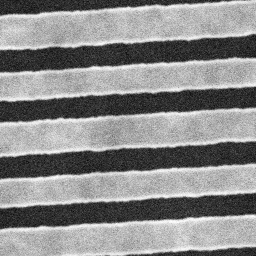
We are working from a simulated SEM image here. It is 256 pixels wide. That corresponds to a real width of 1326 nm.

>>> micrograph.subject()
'lines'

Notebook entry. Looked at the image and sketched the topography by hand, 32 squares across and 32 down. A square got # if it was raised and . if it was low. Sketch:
.........................#######
.........#######################
################################
################################
###############################.
##############..................
................................
............................####
..........######################
################################
################################
##################.#............
##..............................
................................
..............##################
################################
################################
################################
###############.................
#...............................
................................
...............#################
################################
################################
#########################.......
#######.........................
................................
.......................#########
....############################
################################
################################
#####################...........